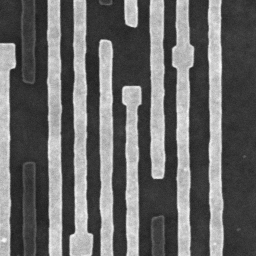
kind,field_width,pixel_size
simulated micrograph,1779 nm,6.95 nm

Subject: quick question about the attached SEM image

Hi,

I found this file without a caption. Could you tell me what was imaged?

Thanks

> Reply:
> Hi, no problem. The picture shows wiring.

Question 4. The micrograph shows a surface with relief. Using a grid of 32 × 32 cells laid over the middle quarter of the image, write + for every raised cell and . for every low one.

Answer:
...++....+++..........+++..+++++
...++....+++..........+++...+++.
...++....+++..........+++...+++.
...++....+++..........+++...+++.
...++....+++..........+++...+++.
...+++...+++..........+++...+++.
...+++...+++...++++...+++...+++.
..++++...+++...++++...+++...+++.
..+++....+++...++++...+++...+++.
..+++....+++...++++...+++...+++.
...++....+++...++++...+++...+++.
...++....+++....++....+++...+++.
...+++...+++....++....+++...+++.
...+++...+++....++....+++...+++.
...+++...+++....++....+++...+++.
...+++...+++....++....+++...+++.
...++....+++....++....+++...+++.
...+++...+++....++....+++...+++.
...+++...+++....++....+++...+++.
...++....+++....++....+++...+++.
...++....+++....++....+++...+++.
...++....+++....+++...+++...+++.
...++....+++....+++...+++...+++.
...++....+++....+++...+++...+++.
...+++...+++....+++...+++....++.
...+++...+++....++....+++...+++.
...+++...+++....++....+++...+++.
...+++...+++....++....+++...+++.
...++....+++....++....+++...+++.
...+++...+++....++..........+++.
...+++...+++....+++.........+++.
...+++...+++....+++.........+++.